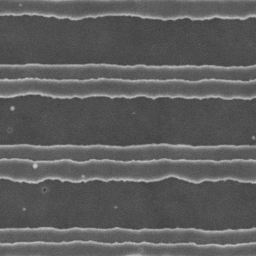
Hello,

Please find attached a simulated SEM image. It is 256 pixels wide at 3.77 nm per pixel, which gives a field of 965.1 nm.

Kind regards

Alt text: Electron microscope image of lines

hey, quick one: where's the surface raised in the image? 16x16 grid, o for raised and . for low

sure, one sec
oooooooooooooooo
................
................
................
oooooooooooooooo
oooooooooooooooo
................
................
................
oooooooooooooooo
oooooooooooooooo
................
................
................
oooooooooooooooo
oooooooooooooooo